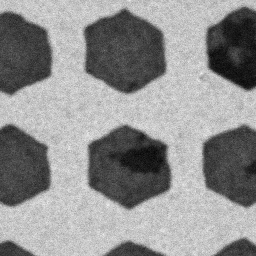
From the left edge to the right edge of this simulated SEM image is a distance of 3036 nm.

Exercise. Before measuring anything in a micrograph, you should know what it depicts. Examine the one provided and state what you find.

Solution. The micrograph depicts holes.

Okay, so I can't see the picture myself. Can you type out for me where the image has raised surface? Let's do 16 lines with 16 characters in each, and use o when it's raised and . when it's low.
oooooooooooooooo
..oooo...oooo...
...oo.....ooo...
...oo.....ooo...
...ooo....ooo...
.oooooo..oooooo.
oooooooooooooooo
oooooooooooooooo
..ooooo..oooo...
...ooo....ooo...
...ooo.....oo...
...ooo.....oo...
..ooooo..ooooo..
oooooooooooooooo
oooooooooooooooo
.oooooo..ooooo..